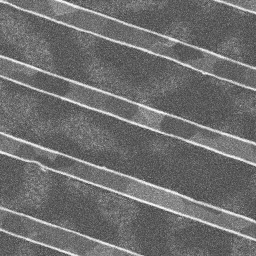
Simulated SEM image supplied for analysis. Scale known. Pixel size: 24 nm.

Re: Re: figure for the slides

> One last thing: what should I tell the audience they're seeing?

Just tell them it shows one or a few lines or trenches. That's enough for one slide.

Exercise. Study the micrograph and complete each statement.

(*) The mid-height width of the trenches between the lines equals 1270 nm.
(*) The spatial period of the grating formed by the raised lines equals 1720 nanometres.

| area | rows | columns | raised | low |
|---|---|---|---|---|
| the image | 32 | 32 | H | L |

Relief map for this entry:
LHHHHHHHHLLLLLLLLLLLLLLLLLLLLHHH
LLLLHHHHHHHHLLLLLLLLLLLLLLLLLLLL
LLLLLLLHHHHHHHHLLLLLLLLLLLLLLLLL
LLLLLLLLLHHHHHHHHLLLLLLLLLLLLLLL
LLLLLLLLLLLLHHHHHHHHLLLLLLLLLLLL
LLLLLLLLLLLLLLLLHHHHHHHLLLLLLLLL
LLLLLLLLLLLLLLLLLLLHHHHHHHLLLLLL
HHLLLLLLLLLLLLLLLLLLLLHHHHHHHLLL
HHHHLLLLLLLLLLLLLLLLLLLLHHHHHHHH
HHHHHHHLLLLLLLLLLLLLLLLLLLLHHHHH
LLLHHHHHHHLLLLLLLLLLLLLLLLLLLLHH
LLLLLLHHHHHHHLLLLLLLLLLLLLLLLLLL
LLLLLLLLHHHHHHHHLLLLLLLLLLLLLLLL
LLLLLLLLLLLHHHHHHHHLLLLLLLLLLLLL
LLLLLLLLLLLLLLHHHHHHHHLLLLLLLLLL
LLLLLLLLLLLLLLLLLHHHHHHHLLLLLLLL
LLLLLLLLLLLLLLLLLLLLHHHHHHHLLLLL
HHHLLLLLLLLLLLLLLLLLLLLHHHHHHHLL
HHHHHLLLLLLLLLLLLLLLLLLLLLHHHHHH
LLHHHHHHLLLLLLLLLLLLLLLLLLLLLHHH
LLLLLHHHHHHLLLLLLLLLLLLLLLLLLLLL
LLLLLLLHHHHHHHLLLLLLLLLLLLLLLLLL
LLLLLLLLLLHHHHHHHLLLLLLLLLLLLLLL
LLLLLLLLLLLLLHHHHHHHLLLLLLLLLLLL
LLLLLLLLLLLLLLLLHHHHHHHLLLLLLLLL
LLLLLLLLLLLLLLLLLLLHHHHHHLLLLLLL
HHLLLLLLLLLLLLLLLLLLLLHHHHHHLLLL
HHHHHLLLLLLLLLLLLLLLLLLLLHHHHHHL
HHHHHHHHLLLLLLLLLLLLLLLLLLLLHHHH
LLHHHHHHHHHLLLLLLLLLLLLLLLLLLLHH
LLLLLHHHHHHHHLLLLLLLLLLLLLLLLLLL
LLLLLLLLHHHHHHHHLLLLLLLLLLLLLLLL